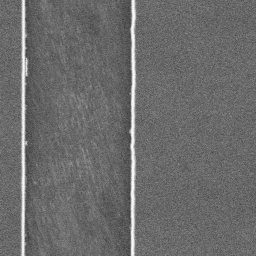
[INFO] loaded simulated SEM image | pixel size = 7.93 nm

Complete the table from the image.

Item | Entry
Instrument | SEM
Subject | one or a few lines or trenches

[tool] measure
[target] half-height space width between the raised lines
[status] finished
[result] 0.87 micrometres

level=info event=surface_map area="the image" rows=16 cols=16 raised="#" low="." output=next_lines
#.......########
#.......########
#.......########
#.......########
#.......########
#.......########
#.......########
#.......########
#.......########
#.......########
#.......########
#.......########
#.......########
#.......########
#.......########
#.......########